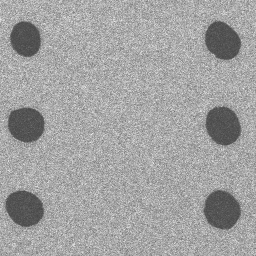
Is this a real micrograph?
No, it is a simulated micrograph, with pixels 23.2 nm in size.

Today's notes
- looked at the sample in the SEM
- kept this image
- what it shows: holes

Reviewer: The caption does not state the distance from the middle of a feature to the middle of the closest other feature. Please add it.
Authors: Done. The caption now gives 1950 nm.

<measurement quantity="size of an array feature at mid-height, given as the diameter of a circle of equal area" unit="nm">852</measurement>